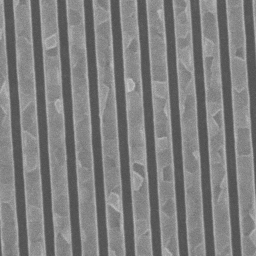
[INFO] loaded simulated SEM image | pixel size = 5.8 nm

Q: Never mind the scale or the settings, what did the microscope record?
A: parallel lines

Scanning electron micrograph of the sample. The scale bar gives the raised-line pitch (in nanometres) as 154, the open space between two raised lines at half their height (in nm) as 60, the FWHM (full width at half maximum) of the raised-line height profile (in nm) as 94.7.